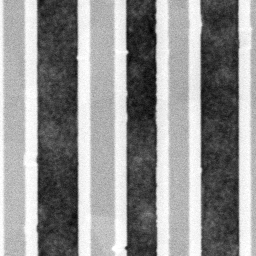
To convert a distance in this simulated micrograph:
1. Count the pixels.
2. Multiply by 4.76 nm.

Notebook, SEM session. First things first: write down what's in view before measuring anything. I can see one or a few lines or trenches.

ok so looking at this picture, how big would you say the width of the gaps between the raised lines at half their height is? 0.237 micrometres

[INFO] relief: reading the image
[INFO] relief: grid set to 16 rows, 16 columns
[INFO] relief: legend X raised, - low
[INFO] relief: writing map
XX---XX---XX---X
XX---XX---XX---X
XX---XX---XX---X
XX---XXX--XX---X
XX---XX---XX---X
XX---XXX--XX---X
XX---XXX--XX---X
XX---XXX--XX---X
XX---XXX--XX---X
XX---XXX--XX---X
XX---XXX--XX---X
XX---XXX--XX---X
XX---XXX--XX---X
XX---XXX--XX---X
XX---XXX--XX---X
XX---XXX--XX---X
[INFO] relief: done